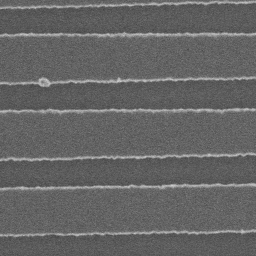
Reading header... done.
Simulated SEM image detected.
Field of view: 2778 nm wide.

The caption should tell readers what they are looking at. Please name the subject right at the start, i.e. lines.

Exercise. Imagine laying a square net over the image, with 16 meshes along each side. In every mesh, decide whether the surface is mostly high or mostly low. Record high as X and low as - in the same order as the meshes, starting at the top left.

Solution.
XX--------------
----------------
XXXXXXXXXXXXXXXX
XXXXXXXXXXXXXXXX
XXXXXXXXXXXXXXXX
----------------
----------------
XXXXXXXXXXXXXXXX
XXXXXXXXXXXXXXXX
XXXXXXXXXXXXXXXX
----------------
----------------
XXXXXXXXXXXXXXXX
XXXXXXXXXXXXXXXX
XXXXXXXXXXXXXX--
----------------